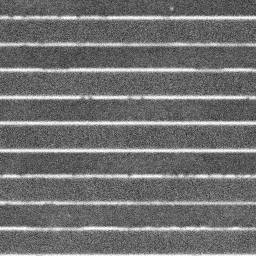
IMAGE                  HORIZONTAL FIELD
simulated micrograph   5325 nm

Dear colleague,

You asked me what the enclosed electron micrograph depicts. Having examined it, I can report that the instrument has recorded lines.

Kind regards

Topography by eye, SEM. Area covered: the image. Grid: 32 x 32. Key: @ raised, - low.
--------------------------------
--------------------------------
@@@@@@@@@@@@@@@@@@@@@@@@@@@@@@@@
@@@@@@@@@@@@@@@@@@@@@@@@@@@@@@@@
@@@@@@@@@@@@@@@@@@@@@@@@@@@@@@@@
@@@@@@@@@@@@@@@@@@@@@@@@@@@@@@@@
--------------------------------
--------------------------------
--------------------------------
@@@@@@@@@@@@@@@@@@@@@@@@@@@@@@@@
@@@@@@@@@@@@@@@@@@@@@@@@@@@@@@@@
@@@@@@@@@@@@@@@@@@@@@@@@@@@@@@@@
--------------------------------
--------------------------------
--------------------------------
@@@@@@@@@@@@@@@@@@@@@@@@@@@@@@@@
@@@@@@@@@@@@@@@@@@@@@@@@@@@@@@@@
@@@@@@@@@@@@@@@@@@@@@@@@@@@@@@@@
@@@@@@@@@@@@@@@@@@@@@@@@@@@@@@@@
--------------------------------
--------------------------------
--------------------------------
@@@@@@@@@@@@@@@@@@@@@@@@@@@@@@@@
@@@@@@@@@@@@@@@@@@@@@@@@@@@@@@@@
@@@@@@@@@@@@@@@@@@@@@@@@@@@@@@@@
--------------------------------
--------------------------------
--------------------------------
--------------------------------
@@@@@@@@@@@@@@@@@@@@@@@@@@@@@@@@
@@@@@@@@@@@@@@@@@@@@@@@@@@@@@@@@
@@@@@@@@@@@@@@@@@@@@@@@@@@@@@@@@